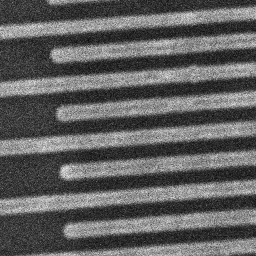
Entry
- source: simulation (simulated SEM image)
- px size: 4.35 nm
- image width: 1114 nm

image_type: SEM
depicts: parallel lines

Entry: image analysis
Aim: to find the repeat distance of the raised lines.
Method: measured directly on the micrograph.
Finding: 126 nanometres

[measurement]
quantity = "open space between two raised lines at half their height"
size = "69.4 nanometres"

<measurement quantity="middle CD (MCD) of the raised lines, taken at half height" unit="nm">56.9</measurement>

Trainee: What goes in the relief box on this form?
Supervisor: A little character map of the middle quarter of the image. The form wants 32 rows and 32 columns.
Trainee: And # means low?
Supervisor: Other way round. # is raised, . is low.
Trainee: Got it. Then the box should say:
................................
...........................#####
..............##################
.###############################
#########################.......
###############.................
................................
................................
..............................##
.................###############
.....###########################
###############################.
###################.............
######..........................
................................
................................
........................########
...........#####################
################################
#########################.......
############....................
................................
................................
...........................#####
..............##################
..##############################
############################....
###############.................
###.............................
................................
..............................##
..................##############